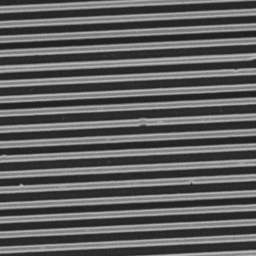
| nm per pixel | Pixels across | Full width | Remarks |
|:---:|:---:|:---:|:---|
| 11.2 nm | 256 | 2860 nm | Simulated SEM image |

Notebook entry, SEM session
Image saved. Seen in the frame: parallel lines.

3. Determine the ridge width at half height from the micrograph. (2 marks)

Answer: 69.7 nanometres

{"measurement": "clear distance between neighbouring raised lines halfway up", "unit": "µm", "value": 0.099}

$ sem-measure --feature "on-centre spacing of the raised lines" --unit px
15